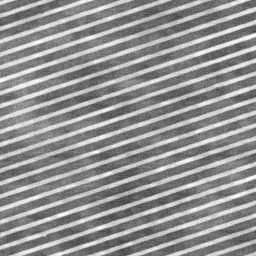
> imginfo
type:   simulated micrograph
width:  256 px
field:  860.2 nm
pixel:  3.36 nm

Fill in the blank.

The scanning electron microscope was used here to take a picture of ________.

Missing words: parallel lines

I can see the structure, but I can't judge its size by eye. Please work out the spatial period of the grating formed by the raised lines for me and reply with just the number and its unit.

41.1 nanometers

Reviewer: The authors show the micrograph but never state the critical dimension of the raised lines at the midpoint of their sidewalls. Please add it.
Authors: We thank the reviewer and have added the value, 0.0116 µm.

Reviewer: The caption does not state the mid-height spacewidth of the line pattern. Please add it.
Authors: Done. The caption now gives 0.0296 microns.